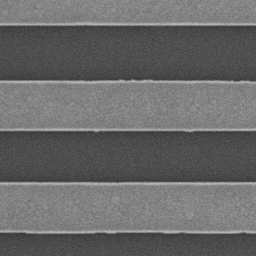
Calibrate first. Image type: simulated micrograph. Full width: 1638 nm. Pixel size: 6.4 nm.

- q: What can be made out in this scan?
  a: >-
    lines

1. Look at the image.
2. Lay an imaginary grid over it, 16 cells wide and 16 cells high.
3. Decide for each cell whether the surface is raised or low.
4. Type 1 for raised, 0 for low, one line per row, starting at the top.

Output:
1111111111111111
1111101111000111
0000000000000000
0000000000000000
0000000000000000
1111111111111111
1111111111111111
1111111111111111
0000000000000000
0000000000000000
0000000000000000
1111111111111111
1111111111111111
1111111111111111
0000000000001100
0000000000000000